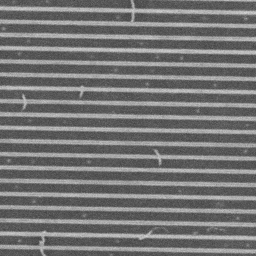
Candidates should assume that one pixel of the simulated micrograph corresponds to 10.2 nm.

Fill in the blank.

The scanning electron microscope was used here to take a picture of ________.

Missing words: parallel lines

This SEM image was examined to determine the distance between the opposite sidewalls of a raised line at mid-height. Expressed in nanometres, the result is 30.7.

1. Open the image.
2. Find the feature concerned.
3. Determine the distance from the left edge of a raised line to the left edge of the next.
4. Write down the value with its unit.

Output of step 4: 136 nanometres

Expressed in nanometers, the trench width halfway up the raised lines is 102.